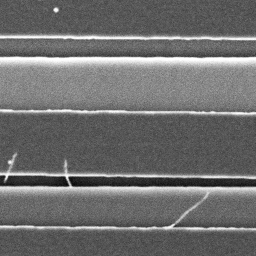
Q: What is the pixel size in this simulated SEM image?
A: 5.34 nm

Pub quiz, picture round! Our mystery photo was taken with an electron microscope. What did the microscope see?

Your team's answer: lines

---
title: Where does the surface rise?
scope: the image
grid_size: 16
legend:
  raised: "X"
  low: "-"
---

XXXXXXXXXXXXXXXX
XXXXXXXXXXXXXXXX
----------------
----------------
----------------
----------------
----------------
XXXXXXXXXXXXXXXX
XXXXXXXXXXXXXXXX
XXXXXXXXXXXXXXXX
XXXXXXXXXXXXXXXX
----------------
----------------
----------------
XXXXXXXXXXXXXXXX
XXXXXXXXXXXXXXXX